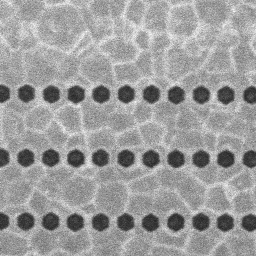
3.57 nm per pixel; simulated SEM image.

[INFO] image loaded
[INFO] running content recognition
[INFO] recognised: a regular array of holes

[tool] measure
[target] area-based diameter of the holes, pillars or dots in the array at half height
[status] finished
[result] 18.2 px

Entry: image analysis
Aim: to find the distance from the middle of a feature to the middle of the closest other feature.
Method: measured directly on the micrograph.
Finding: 24.7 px